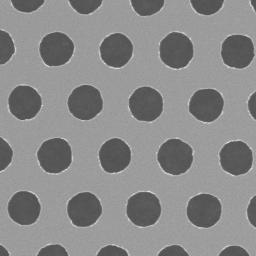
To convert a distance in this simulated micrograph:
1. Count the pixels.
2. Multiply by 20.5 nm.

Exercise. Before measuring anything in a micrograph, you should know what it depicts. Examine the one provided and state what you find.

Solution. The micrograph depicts a regular array of holes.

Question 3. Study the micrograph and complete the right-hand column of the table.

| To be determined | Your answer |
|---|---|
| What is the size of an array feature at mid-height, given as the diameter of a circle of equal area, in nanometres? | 707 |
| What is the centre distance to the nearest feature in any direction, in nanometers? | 1230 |